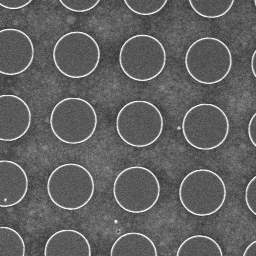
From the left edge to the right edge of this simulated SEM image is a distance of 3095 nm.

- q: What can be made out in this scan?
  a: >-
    an array of small figures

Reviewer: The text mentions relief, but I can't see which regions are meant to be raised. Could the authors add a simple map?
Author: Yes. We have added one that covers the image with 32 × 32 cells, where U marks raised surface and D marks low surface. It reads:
UUUDDDDDUUUUDDDDUUUUUDDDUUUUUDDD
DDDDDDDDDDDDDDDDDUUUDDDDDUUUDDDD
DDDDDDDDDDDDDDDDDDDDDDDDDDDDDDDD
DDDDDDDDDDDDDDDDDDDDDDDDDDDDDDDD
UUUDDDDDUUUDDDDDDUUDDDDDDDDDDDDD
UUUUDDDUUUUUDDDDUUUUDDDDUUUUDDDD
UUUUDDDUUUUUDDDUUUUUUDDUUUUUUDDD
UUUUDDDUUUUUDDDUUUUUUDDUUUUUUDDD
UUUDDDDUUUUUDDDUUUUUDDDUUUUUUDDD
DDDDDDDDDUUDDDDDUUUDDDDDUUUUDDDD
DDDDDDDDDDDDDDDDDDDDDDDDDDDDDDDD
DDDDDDDDDDDDDDDDDDDDDDDDDDDDDDDD
UUUDDDDDUUDDDDDDDDDDDDDDDDDDDDDD
UUUDDDDUUUUUDDDUUUUDDDDDUUUDDDDD
UUUUDDUUUUUUDDDUUUUUDDDUUUUUDDDD
UUUUDDUUUUUUDDDUUUUUDDDUUUUUUDDU
UUUDDDDUUUUUDDDUUUUUDDDUUUUUDDDU
DUDDDDDDUUUDDDDUUUUDDDDUUUUUDDDU
DDDDDDDDDDDDDDDDDDDDDDDDDUUDDDDD
DDDDDDDDDDDDDDDDDDDDDDDDDDDDDDDD
UUDDDDDDDDDDDDDDDDDDDDDDDDDDDDDD
UUUDDDDUUUUDDDDUUUUDDDDDUUUDDDDD
UUUDDDUUUUUUDDDUUUUUDDDUUUUUDDDU
UUUDDDUUUUUUDDUUUUUUDDDUUUUUDDDU
UUUDDDUUUUUDDDUUUUUUDDUUUUUUDDDU
UUDDDDDUUUUDDDDUUUUDDDDUUUUUDDDU
DDDDDDDDDDDDDDDDUUDDDDDDUUUDDDDD
DDDDDDDDDDDDDDDDDDDDDDDDDDDDDDDD
UDDDDDDDDDDDDDDDDDDDDDDDDDDDDDDD
UUDDDDDUUUDDDDDUUUDDDDDDDDDDDDDD
UUUDDDUUUUUDDDUUUUUDDDDUUUUDDDDU
UUUDDDUUUUUDDDUUUUUDDDUUUUUUDDDU